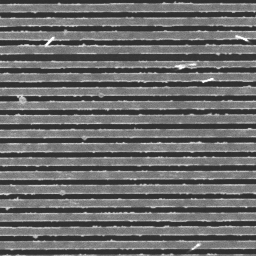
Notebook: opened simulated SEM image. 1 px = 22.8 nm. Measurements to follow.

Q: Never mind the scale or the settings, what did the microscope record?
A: parallel lines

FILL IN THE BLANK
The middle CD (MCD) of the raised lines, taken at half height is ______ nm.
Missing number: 206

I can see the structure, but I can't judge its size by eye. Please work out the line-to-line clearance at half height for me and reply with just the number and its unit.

0.123 um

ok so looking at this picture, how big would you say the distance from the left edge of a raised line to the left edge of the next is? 0.319 micrometres